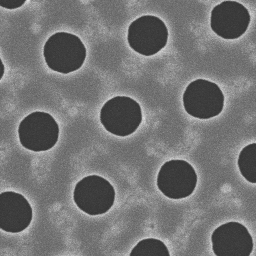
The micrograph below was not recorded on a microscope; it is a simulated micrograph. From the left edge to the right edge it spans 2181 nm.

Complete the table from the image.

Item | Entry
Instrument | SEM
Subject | holes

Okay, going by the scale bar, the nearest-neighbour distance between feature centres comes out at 713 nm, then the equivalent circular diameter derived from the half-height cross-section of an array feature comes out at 346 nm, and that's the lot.